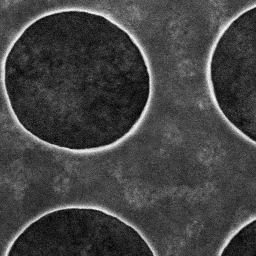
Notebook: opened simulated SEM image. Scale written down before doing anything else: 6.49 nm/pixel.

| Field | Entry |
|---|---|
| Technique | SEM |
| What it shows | holes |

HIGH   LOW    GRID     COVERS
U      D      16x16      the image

UUUUUUUUUUUUUUUU
UUDDDDDUUUUUUUDD
UDDDDDDDUUUUUUDD
DDDDDDDDDUUUUDDD
DDDDDDDDDUUUUDDD
DDDDDDDDDUUUUDDD
UDDDDDDDDUUUUUDD
UDDDDDDDDUUUUUDD
UUDDDDDDUUUUUUUD
UUUUUUUUUUUUUUUU
UUUUUUUUUUUUUUUU
UUUUUUUUUUUUUUUU
UUUUUUUUUUUUUUUU
UUUDDDDUUUUUUUUU
UDDDDDDDDUUUUUUD
UDDDDDDDDUUUUUDD